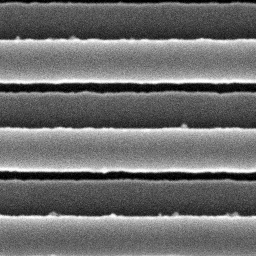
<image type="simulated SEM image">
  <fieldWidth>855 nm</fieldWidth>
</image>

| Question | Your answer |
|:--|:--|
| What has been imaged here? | lines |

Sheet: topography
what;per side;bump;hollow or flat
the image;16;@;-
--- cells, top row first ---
----------------
----------------
-@@@@@@@@-@@@@@@
@@@@@@@@@@@@@@@@
@@@@@@@@@@@@@@@@
----------------
----------------
----------------
@@@@@@@@@@@@@@@@
@@@@@@@@@@@@@@@@
@@@@@@@@@@@@@@@@
----------------
----------------
----------------
@@@@@@@@@@@@@@@@
@@@@@@@@@@@@@@@@